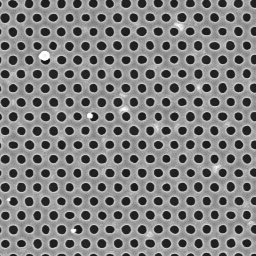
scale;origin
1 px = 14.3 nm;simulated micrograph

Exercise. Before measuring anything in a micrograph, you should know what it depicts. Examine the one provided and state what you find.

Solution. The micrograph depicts a regular array of holes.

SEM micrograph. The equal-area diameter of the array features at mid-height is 126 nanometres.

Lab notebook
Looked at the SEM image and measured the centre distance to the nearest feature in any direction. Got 226 nanometers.